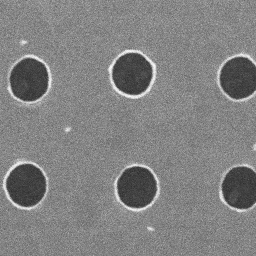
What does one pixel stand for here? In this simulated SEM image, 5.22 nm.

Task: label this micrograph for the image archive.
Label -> holes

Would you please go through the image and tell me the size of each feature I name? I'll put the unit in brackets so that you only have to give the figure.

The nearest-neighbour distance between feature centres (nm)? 545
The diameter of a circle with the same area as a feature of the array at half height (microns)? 0.22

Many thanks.